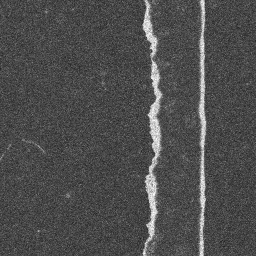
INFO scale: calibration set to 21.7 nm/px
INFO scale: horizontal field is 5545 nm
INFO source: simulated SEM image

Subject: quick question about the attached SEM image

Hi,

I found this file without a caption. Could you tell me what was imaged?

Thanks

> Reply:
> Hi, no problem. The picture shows one or a few lines or trenches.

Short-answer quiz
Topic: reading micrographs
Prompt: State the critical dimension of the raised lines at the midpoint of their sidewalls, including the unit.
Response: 1110 nanometers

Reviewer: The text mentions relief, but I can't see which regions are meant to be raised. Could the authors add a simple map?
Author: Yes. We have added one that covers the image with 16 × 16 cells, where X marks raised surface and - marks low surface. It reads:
---------XXXX---
---------XXXX---
---------XXXX---
----------XXX---
----------XXX---
----------XXX---
----------XXX---
----------XXX---
----------XXX---
----------XXX---
---------XXXX---
---------XXXX---
---------XXXX---
----------XXX---
---------XXXX---
---------XXXX---